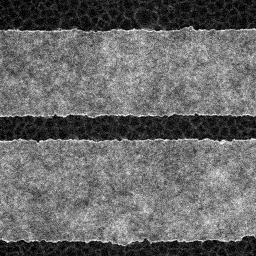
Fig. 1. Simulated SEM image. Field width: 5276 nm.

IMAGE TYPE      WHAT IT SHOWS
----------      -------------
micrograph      one or a few lines or trenches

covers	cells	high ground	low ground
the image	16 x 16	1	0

0000000000000000
0000000000000000
1111111111111111
1111111111111111
1111111111111111
1111111111111111
1111111111111111
0000000000000000
0000000000000000
1111111111111111
1111111111111111
1111111111111111
1111111111111111
1111111111111111
1111111111111111
0000000000000000